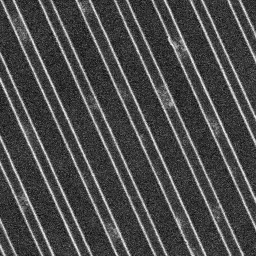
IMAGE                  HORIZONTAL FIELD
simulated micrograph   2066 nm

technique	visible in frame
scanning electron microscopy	parallel lines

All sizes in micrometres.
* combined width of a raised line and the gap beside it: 0.278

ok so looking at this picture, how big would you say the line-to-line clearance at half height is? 185 nanometres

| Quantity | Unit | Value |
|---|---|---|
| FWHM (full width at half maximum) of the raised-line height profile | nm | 95.5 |